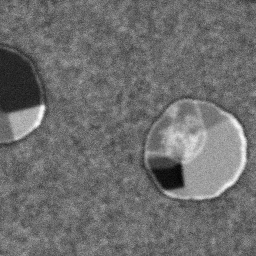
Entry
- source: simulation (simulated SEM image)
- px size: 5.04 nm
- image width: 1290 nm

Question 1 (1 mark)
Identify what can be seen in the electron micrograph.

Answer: raised bodies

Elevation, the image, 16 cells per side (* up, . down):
................
................
................
*...............
**..............
***.............
***........**...
***.......*****.
*........**.***.
.........******.
.........******.
..........****..
................
................
................
................